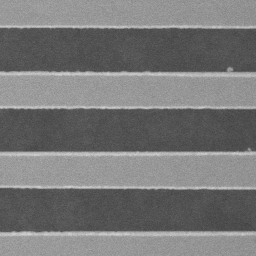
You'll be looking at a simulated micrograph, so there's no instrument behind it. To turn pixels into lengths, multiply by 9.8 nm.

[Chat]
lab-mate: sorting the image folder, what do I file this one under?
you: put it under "lines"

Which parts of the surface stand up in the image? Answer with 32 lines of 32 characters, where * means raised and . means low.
********************************
********************************
********************************
..*......************.**********
................................
................................
................................
................................
................................
********************************
********************************
********************************
********************************
********************************
................................
................................
................................
................................
................................
********************************
********************************
********************************
********************************
.*******************************
................................
................................
................................
................................
................................
********************************
********************************
********************************